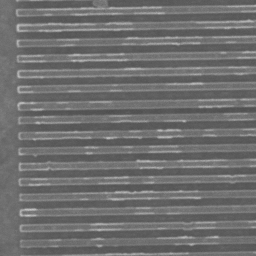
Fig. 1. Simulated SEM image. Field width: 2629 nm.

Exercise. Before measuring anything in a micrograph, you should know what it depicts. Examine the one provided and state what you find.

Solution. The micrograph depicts parallel lines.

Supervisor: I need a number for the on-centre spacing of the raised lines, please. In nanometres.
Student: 158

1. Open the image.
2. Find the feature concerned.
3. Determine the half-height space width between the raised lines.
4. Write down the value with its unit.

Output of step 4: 89.9 nanometres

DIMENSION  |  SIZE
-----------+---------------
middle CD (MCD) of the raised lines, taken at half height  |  71.9 nanometres